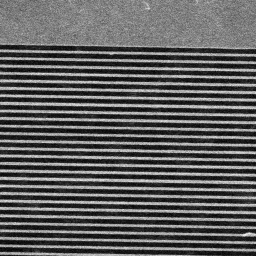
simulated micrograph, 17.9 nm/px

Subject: parallel lines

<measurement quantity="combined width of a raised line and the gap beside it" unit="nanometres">134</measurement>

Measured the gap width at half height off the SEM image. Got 98.3 nanometres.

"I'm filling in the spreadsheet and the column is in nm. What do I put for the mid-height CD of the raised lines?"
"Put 35.8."